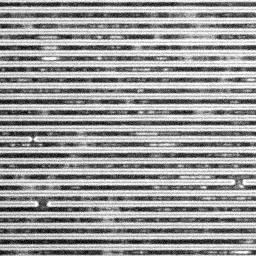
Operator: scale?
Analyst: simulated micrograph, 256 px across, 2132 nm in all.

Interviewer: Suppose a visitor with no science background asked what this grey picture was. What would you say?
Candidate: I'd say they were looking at parallel lines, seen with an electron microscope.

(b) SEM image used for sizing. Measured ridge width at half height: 31.2 nm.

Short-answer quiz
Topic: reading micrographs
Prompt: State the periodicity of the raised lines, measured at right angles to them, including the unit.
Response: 10.8 px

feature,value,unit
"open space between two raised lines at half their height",54.1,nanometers